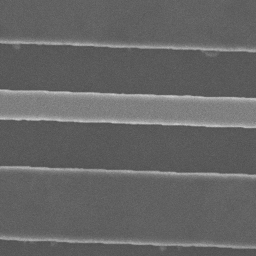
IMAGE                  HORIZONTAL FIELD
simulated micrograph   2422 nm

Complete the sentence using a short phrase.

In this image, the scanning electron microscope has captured lines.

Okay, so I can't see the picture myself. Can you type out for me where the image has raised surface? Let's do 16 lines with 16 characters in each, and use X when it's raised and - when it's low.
XXXXXXXXXXXXXXXX
XXXXXXXXXXXXXXXX
XXXXXXXXXXXXXXXX
----------------
----------------
----------------
XXXXXXXXXXXXXXXX
XXXXXXXXXXXXXXXX
----------------
----------------
XXX-------------
XXXXXXXXXXXXXXXX
XXXXXXXXXXXXXXXX
XXXXXXXXXXXXXXXX
XXXXXXXXXXXXXXXX
--------------XX